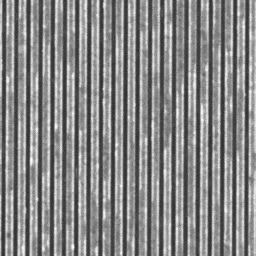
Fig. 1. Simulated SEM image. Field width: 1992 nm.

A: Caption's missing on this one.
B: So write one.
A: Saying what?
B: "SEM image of parallel lines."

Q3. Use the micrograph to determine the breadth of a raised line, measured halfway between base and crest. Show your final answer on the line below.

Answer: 7.12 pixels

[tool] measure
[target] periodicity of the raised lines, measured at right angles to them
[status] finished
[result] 94.6 nm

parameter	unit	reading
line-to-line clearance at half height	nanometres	37